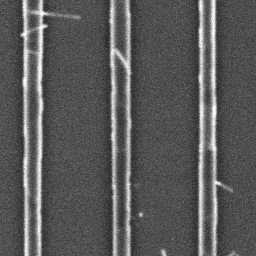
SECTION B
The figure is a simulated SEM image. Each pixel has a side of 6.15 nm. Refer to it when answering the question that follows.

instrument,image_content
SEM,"lines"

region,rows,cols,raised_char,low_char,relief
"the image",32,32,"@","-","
---@@---------@@---------@@-----
---@@---------@@---------@@-----
---@@---------@@---------@@-----
---@@---------@@---------@@-----
---@@---------@@---------@@-----
---@@---------@@---------@@-----
---@@---------@@---------@@-----
---@@---------@@---------@@-----
---@@---------@@---------@@-----
---@@---------@@---------@@-----
---@@---------@@---------@@-----
---@@---------@@---------@@-----
---@@---------@@---------@@-----
---@@---------@@---------@@-----
---@@---------@@---------@@-----
---@@---------@@---------@@-----
---@@---------@@---------@@-----
---@@---------@@---------@@-----
---@@---------@@---------@@-----
---@@---------@@---------@@-----
---@@---------@@---------@@-----
---@@---------@@---------@@-----
---@@---------@@---------@@-----
---@@---------@@---------@@-----
---@@---------@@---------@@-----
---@@---------@@---------@@-----
---@@---------@@---------@@-----
---@@---------@@---------@@-----
---@@---------@@---------@@-----
---@@---------@@---------@@-----
---@@---------@@---------@@-----
---@@---------@@---------@@-----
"